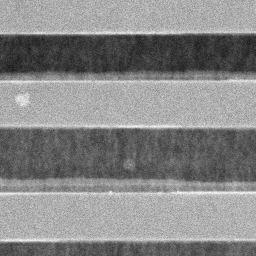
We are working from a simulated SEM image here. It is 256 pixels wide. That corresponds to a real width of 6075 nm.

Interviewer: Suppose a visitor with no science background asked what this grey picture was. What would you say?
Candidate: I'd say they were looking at lines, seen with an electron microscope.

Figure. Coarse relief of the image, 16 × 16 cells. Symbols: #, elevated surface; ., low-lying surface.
################
################
................
................
................
################
################
################
................
................
................
................
################
################
################
................